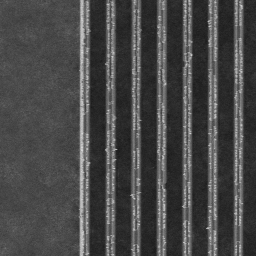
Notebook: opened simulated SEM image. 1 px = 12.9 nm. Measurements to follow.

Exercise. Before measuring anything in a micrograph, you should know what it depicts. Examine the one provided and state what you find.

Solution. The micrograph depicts parallel lines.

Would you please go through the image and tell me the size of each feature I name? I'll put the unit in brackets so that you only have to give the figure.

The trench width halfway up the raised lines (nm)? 245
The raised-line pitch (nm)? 330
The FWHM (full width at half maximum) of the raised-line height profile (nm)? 90.3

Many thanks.